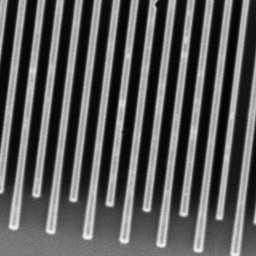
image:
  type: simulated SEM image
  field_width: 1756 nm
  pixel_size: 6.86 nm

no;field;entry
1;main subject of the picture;parallel lines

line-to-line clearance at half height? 0.074 um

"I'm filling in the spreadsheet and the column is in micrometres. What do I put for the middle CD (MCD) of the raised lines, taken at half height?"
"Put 0.0536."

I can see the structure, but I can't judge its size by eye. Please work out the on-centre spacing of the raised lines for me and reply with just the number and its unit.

127 nanometres